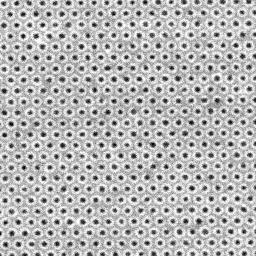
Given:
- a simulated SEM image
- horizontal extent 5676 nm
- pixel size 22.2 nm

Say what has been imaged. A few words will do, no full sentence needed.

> a regular array of holes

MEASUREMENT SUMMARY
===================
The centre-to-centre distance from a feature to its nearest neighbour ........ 273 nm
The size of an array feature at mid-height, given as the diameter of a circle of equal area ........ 6.77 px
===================